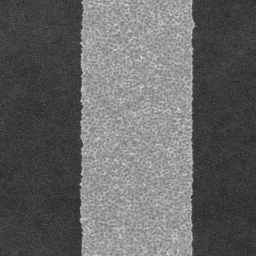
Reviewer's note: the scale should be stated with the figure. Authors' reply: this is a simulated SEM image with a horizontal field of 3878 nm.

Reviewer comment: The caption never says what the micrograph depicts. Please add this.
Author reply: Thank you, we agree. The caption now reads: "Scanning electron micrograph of one or a few lines or trenches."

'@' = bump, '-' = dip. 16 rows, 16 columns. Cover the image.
-----@@@@@@@----
-----@@@@@@@----
-----@@@@@@@----
-----@@@@@@@----
-----@@@@@@@----
-----@@@@@@@----
-----@@@@@@@----
-----@@@@@@@----
-----@@@@@@@----
-----@@@@@@@----
-----@@@@@@@----
-----@@@@@@@----
-----@@@@@@@----
-----@@@@@@@----
-----@@@@@@@----
-----@@@@@@@----